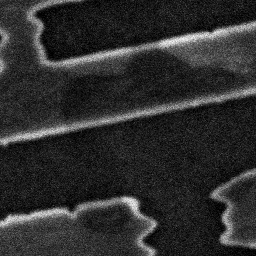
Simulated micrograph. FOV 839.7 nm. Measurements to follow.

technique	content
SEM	one or a few lines or trenches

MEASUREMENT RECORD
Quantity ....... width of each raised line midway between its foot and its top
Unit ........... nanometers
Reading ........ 218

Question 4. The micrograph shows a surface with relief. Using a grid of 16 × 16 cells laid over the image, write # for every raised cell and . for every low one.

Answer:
##..............
##..............
##.........#####
###...##########
################
################
############....
#######.........
##..............
................
................
..............##
.......#......##
..#######.....##
#########.....##
#########.......